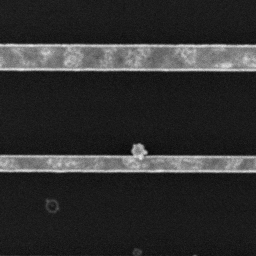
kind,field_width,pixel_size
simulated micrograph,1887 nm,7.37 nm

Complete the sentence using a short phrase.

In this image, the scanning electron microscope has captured one or a few lines or trenches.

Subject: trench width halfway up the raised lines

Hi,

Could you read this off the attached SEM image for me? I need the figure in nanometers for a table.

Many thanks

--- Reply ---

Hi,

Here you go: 639